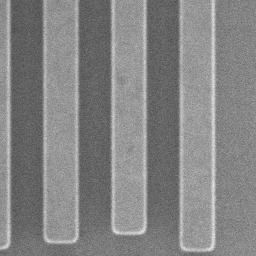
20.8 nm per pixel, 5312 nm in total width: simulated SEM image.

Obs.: groups of lines, slits or small figures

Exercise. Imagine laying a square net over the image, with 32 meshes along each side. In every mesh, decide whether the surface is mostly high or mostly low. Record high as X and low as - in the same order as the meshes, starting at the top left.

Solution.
X-----XXXX----XXXX-----XXXX-----
X-----XXXX----XXXX-----XXXX-----
X-----XXXX----XXXX-----XXXX-----
X-----XXXX----XXXX-----XXXX-----
X-----XXXX----XXXX-----XXXX-----
X-----XXXX----XXXX-----XXXX-----
X-----XXXX----XXXX-----XXXX-----
X-----XXXX----XXXX-----XXXX-----
X-----XXXX----XXXX-----XXXX-----
X-----XXXX----XXXX-----XXXX-----
X-----XXXX----XXXX-----XXXX-----
X-----XXXX----XXXX-----XXXX-----
X-----XXXX----XXXX-----XXXX-----
X-----XXXX----XXXX-----XXXX-----
X-----XXXX----XXXX-----XXXX-----
X-----XXXX----XXXX-----XXXX-----
X-----XXXX----XXXX-----XXXX-----
X-----XXXX----XXXX-----XXXX-----
X-----XXXX----XXXX-----XXXX-----
X-----XXXX----XXXX-----XXXX-----
X-----XXXX----XXXX-----XXXX-----
X-----XXXX----XXXX-----XXXX-----
X-----XXXX----XXXX-----XXXX-----
X-----XXXX----XXXX-----XXXX-----
X-----XXXX----XXXX-----XXXX-----
X-----XXXX----XXXX-----XXXX-----
X-----XXXX----XXXX-----XXXX-----
X-----XXXX----XXXX-----XXXX-----
X-----XXXX----XXXX-----XXXX-----
X-----XXXX-------------XXXX-----
X----------------------XXXX-----
--------------------------------